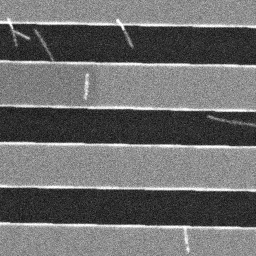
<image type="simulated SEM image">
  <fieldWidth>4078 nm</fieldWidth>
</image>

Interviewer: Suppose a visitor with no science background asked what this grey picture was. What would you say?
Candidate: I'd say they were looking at lines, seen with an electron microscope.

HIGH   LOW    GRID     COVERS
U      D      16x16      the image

UUUUUUUUUUUUUUUU
UDDDDUUUUUUUUUUU
DDDDDDDDDDDDDDDD
DDDDDDDDDDDDDDDD
UUUUUUUUUUUUUUUU
UUUUUUUUUUUUUUUU
UUUUUUUUUUUUUUUU
DDDDDDDDDDDDDDDD
DDDDDDDDDDDDDDDD
UUUUUUUUUUUUUUUU
UUUUUUUUUUUUUUUU
UUUUUUUUUUUUUUUU
DDDDDDDDDDDDDDDD
DDDDDDDDDDDDDDDD
UUUUUUUUUUUUUUUU
UUUUUUUUUUUUUUUU